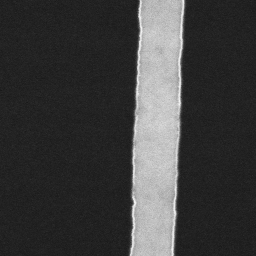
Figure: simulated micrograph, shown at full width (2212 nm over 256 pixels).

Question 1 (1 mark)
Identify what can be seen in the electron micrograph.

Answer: one or a few lines or trenches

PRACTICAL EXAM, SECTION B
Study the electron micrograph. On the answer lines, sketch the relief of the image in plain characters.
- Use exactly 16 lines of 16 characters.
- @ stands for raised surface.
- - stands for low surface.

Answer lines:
@@@@@@@@@--@@@@@
@@@@@@@@@--@@@@@
@@@@@@@@@--@@@@@
@@@@@@@@@--@@@@@
@@@@@@@@@--@@@@@
@@@@@@@@@--@@@@@
@@@@@@@@@--@@@@@
@@@@@@@@@--@@@@@
@@@@@@@@---@@@@@
@@@@@@@@---@@@@@
@@@@@@@@---@@@@@
@@@@@@@@---@@@@@
@@@@@@@@---@@@@@
@@@@@@@@---@@@@@
@@@@@@@@---@@@@@
@@@@@@@@---@@@@@